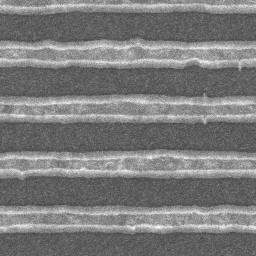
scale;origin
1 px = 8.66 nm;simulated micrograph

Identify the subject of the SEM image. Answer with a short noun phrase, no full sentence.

parallel lines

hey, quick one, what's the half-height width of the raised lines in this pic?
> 0.165 um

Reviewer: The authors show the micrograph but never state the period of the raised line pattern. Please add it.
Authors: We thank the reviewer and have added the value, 477 nanometres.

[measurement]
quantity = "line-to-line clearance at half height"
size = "312 nanometers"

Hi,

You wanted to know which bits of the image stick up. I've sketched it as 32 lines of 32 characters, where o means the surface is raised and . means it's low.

oooooooooooooooooooooooooooooooo
................................
................................
................................
................................
.....oo.....oo..oo..............
oooooooooooooooooooooooooooooooo
oooooooooooooooooooooooooooooooo
................................
................................
................................
................................
.......oooooooooooooo...........
oooooooooooooooooooooooooooooooo
oooooooooooooooooooooooooooooooo
................................
................................
................................
................................
ooooooo.o...oooooooooooooooooo..
oooooooooooooooooooooooooooooooo
oooooooooooooooooooooooooooooooo
................................
................................
................................
................................
oooooooooooooooooooooooooooooooo
oooooooooooooooooooooooooooooooo
oooooooooo..oooooooooooooooooooo
................................
................................
................................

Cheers